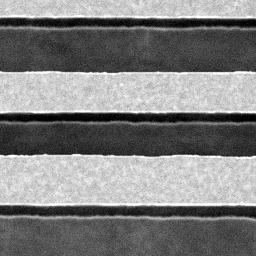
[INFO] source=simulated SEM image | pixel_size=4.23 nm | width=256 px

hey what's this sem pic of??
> lines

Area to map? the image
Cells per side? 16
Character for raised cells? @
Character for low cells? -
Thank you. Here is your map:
@@@@@@@@@@@@@@@@
----------------
----------------
----------------
----------------
@@@@@@@@@@@@@@@@
@@@@@@@@@@@@@@@@
----------------
----------------
----------------
@@@@@@@@@@@@@@@@
@@@@@@@@@@@@@@@@
@@@@@@@@@@@@@@@@
----------------
----------------
----------------